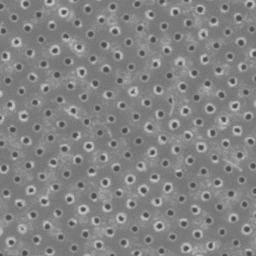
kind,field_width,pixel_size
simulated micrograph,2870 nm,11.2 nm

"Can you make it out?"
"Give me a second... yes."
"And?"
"a regular array of holes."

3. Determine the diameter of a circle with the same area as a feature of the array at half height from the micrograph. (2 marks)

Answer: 68.1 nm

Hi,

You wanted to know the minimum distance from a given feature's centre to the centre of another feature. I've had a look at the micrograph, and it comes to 192 nanometres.